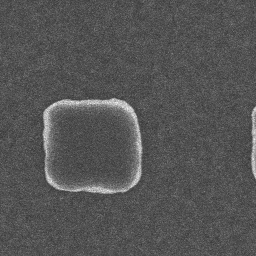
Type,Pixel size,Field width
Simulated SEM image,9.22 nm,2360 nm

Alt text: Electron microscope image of raised bodies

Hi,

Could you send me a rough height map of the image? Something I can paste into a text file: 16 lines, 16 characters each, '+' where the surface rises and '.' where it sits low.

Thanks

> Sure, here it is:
................
................
................
................
................
................
...++++.........
...++++++.......
...++++++.......
...++++++.......
...++++++.......
...+++++........
................
................
................
................